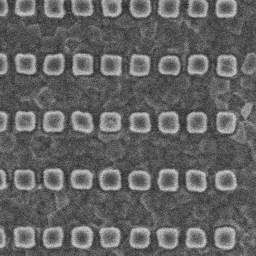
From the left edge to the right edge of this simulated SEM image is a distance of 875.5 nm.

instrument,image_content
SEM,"a regular array of raised bodies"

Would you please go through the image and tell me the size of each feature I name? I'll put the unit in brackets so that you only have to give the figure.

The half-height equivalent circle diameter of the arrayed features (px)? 20.9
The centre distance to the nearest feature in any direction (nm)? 97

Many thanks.